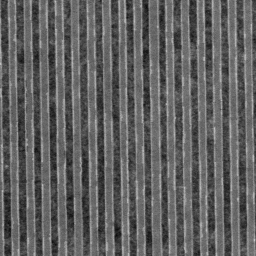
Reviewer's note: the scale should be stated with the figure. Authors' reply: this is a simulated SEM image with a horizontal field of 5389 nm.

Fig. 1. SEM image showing parallel lines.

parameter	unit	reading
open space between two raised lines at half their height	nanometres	176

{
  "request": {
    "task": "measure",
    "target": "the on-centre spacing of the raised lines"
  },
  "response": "331 nanometres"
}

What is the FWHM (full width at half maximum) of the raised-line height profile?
0.158 micrometres